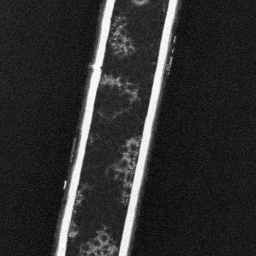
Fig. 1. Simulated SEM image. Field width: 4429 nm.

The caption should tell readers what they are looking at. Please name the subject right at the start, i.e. one or a few lines or trenches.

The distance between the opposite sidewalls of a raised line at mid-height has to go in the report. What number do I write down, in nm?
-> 1080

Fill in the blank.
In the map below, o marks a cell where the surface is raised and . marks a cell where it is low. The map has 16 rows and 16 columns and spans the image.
.......oooo.....
.......oooo.....
......oooo......
......oooo......
......oooo......
......oooo......
......oooo......
.....oooo.......
.....oooo.......
.....oooo.......
.....oooo.......
.....oooo.......
....oooo........
....oooo........
....oooo........
....oooo........